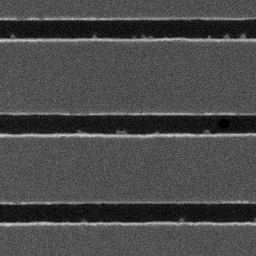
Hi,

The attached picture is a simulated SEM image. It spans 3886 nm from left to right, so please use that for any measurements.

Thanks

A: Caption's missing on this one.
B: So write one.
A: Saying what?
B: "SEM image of lines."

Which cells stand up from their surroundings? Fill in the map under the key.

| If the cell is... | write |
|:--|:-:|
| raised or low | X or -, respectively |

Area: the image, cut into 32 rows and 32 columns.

XXXXXXXXXXXXXXXXXXXXXXXXXXXXXXXX
XXXXXXXXXXXXXXXXXXXXXXXXXXXXXXXX
--------------------------------
--------------------------------
--------------------------------
XXXXXXXXXXXXXXXXXXXXXXXXXXXXXXXX
XXXXXXXXXXXXXXXXXXXXXXXXXXXXXXXX
XXXXXXXXXXXXXXXXXXXXXXXXXXXXXXXX
XXXXXXXXXXXXXXXXXXXXXXXXXXXXXXXX
XXXXXXXXXXXXXXXXXXXXXXXXXXXXXXXX
XXXXXXXXXXXXXXXXXXXXXXXXXXXXXXXX
XXXXXXXXXXXXXXXXXXXXXXXXXXXXXXXX
XXXXXXXXXXXXXXXXXXXXXXXXXXXXXXXX
XXXXXXXXXXXXXXXXXXXXXXXXXXXXXXXX
--------------------------------
--------------------------------
--------------------------------
XXXXXXXXXXXXXXXXXXXXXXXXXXXXXXXX
XXXXXXXXXXXXXXXXXXXXXXXXXXXXXXXX
XXXXXXXXXXXXXXXXXXXXXXXXXXXXXXXX
XXXXXXXXXXXXXXXXXXXXXXXXXXXXXXXX
XXXXXXXXXXXXXXXXXXXXXXXXXXXXXXXX
XXXXXXXXXXXXXXXXXXXXXXXXXXXXXXXX
XXXXXXXXXXXXXXXXXXXXXXXXXXXXXXXX
XXXXXXXXXXXXXXXXXXXXXXXXXXXXXXXX
--------------------------------
--------------------------------
--------------------------------
XXXXXXXXXXXXXXXXXXXXXXXXXXXXXXXX
XXXXXXXXXXXXXXXXXXXXXXXXXXXXXXXX
XXXXXXXXXXXXXXXXXXXXXXXXXXXXXXXX
XXXXXXXXXXXXXXXXXXXXXXXXXXXXXXXX